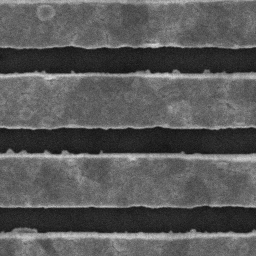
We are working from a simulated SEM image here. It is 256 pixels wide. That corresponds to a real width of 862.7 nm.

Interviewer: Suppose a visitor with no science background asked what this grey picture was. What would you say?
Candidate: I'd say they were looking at lines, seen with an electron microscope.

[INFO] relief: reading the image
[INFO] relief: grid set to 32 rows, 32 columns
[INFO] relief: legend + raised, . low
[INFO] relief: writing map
++++++++++++++++++++++++++++++++
++++++++++++++++++++++++++++++++
++++++++++++++++++++++++++++++++
++++++++++++++++++++++++++++++++
++++++++++++++++++++++++++++++++
++++++++++++++++++++++++++++++++
................................
................................
................................
++++++++++++++++++++++++++++++++
++++++++++++++++++++++++++++++++
++++++++++++++++++++++++++++++++
++++++++++++++++++++++++++++++++
++++++++++++++++++++++++++++++++
++++++++++++++++++++++++++++++++
++++++++++++++++++++++++++++++++
................................
................................
................................
+++++++++++++++++++++++++++++..+
++++++++++++++++++++++++++++++++
++++++++++++++++++++++++++++++++
++++++++++++++++++++++++++++++++
++++++++++++++++++++++++++++++++
++++++++++++++++++++++++++++++++
++++++++++++++++++++++++++++++++
................................
................................
................................
++++++++++++++++++++++++++++++++
++++++++++++++++++++++++++++++++
++++++++++++++++++++++++++++++++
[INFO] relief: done